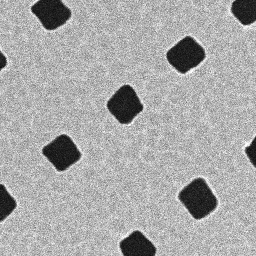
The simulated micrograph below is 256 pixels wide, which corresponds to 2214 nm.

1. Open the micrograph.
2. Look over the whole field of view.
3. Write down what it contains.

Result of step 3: holes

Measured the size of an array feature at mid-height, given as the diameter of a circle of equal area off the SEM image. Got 299 nm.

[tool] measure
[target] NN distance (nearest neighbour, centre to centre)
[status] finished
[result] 0.681 µm